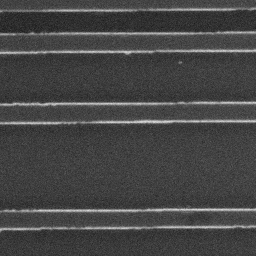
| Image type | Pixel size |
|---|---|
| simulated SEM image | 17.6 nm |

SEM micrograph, lines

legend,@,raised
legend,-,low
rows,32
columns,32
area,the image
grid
@@@@@@@@@@@@@@@@@@@@@@@@@@@@@@@@
--------------------------------
--------------------------------
--------------------------------
@@@@@@@@@@@@@@@@@@@@@@@@@@@@@@@@
@@@@@@@@@@@@@@@@@@@@@@@@@@@@@@@@
@-------------------------------
--------------------------------
--------------------------------
--------------------------------
--------------------------------
--------------------------------
--------------------------------
@@@@@@@@@@@@@@@@@@@@@@@@@@@@@@@@
@@@@@@@@@@@@@@@@@@@@@@@@@@@@@@@@
--------------------------------
--------------------------------
--------------------------------
--------------------------------
--------------------------------
--------------------------------
--------------------------------
--------------------------------
--------------------------------
--------------------------------
--------------------------------
@@@@@@@@@@@@@@@@@@@@@@@@@@@@@@@@
@@@@@@@@@@@@@@@@@@@@@@@@@@@@@@@@
@@@@@@@@@@@@@@@@----------------
--------------------------------
--------------------------------
--------------------------------